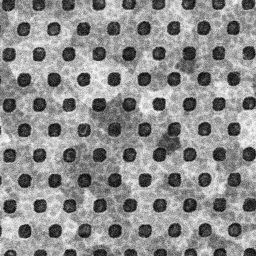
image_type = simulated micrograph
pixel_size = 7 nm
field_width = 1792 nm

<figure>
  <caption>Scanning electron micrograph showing a regular array of holes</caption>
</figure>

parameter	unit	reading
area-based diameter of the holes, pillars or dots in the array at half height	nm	106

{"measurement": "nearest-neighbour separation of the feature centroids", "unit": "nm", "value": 204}